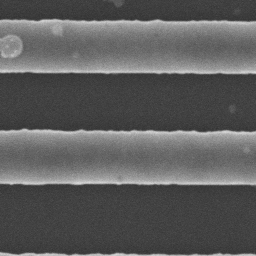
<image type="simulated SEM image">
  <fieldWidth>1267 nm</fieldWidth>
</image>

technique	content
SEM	lines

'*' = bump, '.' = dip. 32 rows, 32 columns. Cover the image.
................................
................................
......*.........................
********************************
********************************
********************************
********************************
********************************
********************************
................................
................................
................................
................................
................................
................................
................................
*************************.******
********************************
********************************
********************************
********************************
********************************
********************************
................................
................................
................................
................................
................................
................................
................................
................................
................................